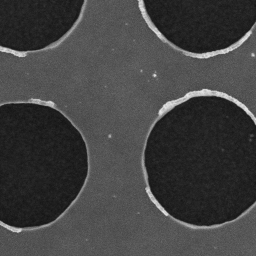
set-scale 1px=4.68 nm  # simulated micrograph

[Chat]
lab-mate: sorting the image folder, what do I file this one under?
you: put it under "holes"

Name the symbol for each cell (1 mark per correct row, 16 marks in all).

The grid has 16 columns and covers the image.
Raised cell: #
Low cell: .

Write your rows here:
.....####.......
.....#####......
....######.....#
################
################
################
#.#########....#
....######......
.....####.......
.....####.......
.....####.......
.....####.......
.....#####......
....#######....#
################
################